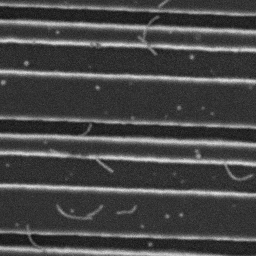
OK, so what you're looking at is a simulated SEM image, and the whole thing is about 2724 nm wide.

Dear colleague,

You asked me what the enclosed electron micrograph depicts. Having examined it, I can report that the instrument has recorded lines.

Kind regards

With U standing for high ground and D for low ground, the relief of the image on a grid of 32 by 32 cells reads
UUUUUUUUUUUUUUUUUUUUUUUUUUUUUUUU
DDDDDDDDDDDDDDDDDDDDDDUUUUUUUUUU
DDDDDDDDDDDDDDDDDDDDDDDDDDDDDDDD
UUUUUUUUUUUUUUUUUUUUDDDDDDDDDDDD
UUUUUUUUUUUUUUUUUUUUUUUUUUUUUUUU
DDDDDDDDDUUUUUUUUUUUUUUUUUUUUUUU
DDDDDDDDDDDDDDDDDDDDDDDDDDDDDDDD
DDDDDDDDDDDDDDDDDDDDDDDDDDDDDDDD
DDDDDDDDDDDDDDDDDDDDDDDDDDDDDDDD
UUUUUUUUUUUUUUUDDDDDDDDDDDDDDDDD
UUUUUUUUUUUUUUUUUUUUUUUUUUUUUUUU
UUUUUUUUUUUUUUUUUUUUUUUUUUUUUUUU
UUUUUUUUUUUUUUUUUUUUUUUUUUUUUUUU
UUUUUUUUUUUUUUUUUUUUUUUUUUUUUUUU
UUUUUUUUUUUUUUUUUUUUUUUUUUUUUUUU
DDDDDDDDDDDDDDDDDDDDDUUUUUUUUUUU
DDDDDDDDDDDDDDDDDDDDDDDDDDDDDDDD
UUUUUUUUUUUUUUUUUUDDDDDDDDDDDDDD
UUUUUUUUUUUUUUUUUUUUUUUUUUUUUUUU
DDDDDDDDUUUUUUUUUUUUUUUUUUUUUUUU
DDDDDDDDDDDDDDDDDDDDDDDDDDDDUDUU
DDDDDDDDDDDDDDDDDDDDDDDDDDDDDDDD
DDDDDDDDDDDDDDDDDDDDDDDDDDDDDDDD
UUUUUUUUUUUDDDDDDDDDDDDDDDDDDDDD
UUUUUUUUUUUUUUUUUUUUUUUUUUUUUUUU
UUUUUUUUUUUUUUUUUUUUUUUUUUUUUUUU
UUUUUUUUUUUUUUUUUUUUUUUUUUUUUUUU
UUUUUUUUUUUUUUUUUUUUUUUUUUUUUUUU
UUUUUUUUUUUUUUUUUUUUUUUUUUUUUUUU
DDDDDDDDDDDDDUUUUUUUUUUUUUUUUUUU
DDDDDDDDDDDDDDDDDDDDDDDDDDDDDDDD
UUUUUUUUUUUUUUDDDDDDDDDDDDDDDDDD